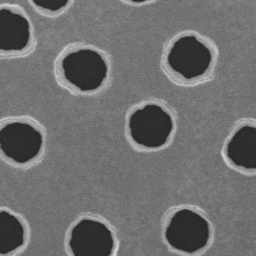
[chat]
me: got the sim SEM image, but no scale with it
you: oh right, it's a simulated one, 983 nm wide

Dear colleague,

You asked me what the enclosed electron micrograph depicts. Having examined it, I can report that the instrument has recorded holes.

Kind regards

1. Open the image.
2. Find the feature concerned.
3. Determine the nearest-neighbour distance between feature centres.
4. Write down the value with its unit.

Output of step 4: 317 nanometers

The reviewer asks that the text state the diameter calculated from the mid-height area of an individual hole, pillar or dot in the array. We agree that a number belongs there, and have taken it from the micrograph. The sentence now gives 174 nm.